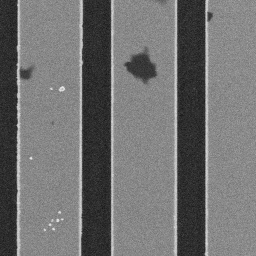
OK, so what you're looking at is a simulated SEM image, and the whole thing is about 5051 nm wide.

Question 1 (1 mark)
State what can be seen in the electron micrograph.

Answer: lines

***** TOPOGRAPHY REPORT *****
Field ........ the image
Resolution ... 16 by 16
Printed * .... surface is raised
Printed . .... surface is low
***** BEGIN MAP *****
.****..****..***
.****..****..***
.****..****..***
.****..****..***
.****..****..***
.****..****..***
.****..****..***
.****..****..***
.****..****..***
.****..****..***
.****..****..***
.****..****..***
.****..****..***
.****..****..***
.****..****..***
.****..****..***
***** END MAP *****